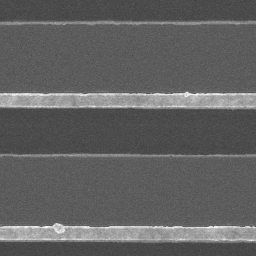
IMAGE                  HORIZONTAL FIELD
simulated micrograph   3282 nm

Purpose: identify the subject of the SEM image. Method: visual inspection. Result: lines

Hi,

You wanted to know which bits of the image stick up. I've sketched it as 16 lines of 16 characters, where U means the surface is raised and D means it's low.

DDDDDDDDDDDDDDDD
UUUUUUUUUUUUUUUU
UUUUUUUUUUUUUUUU
UUUUUUUUUUUUUUUU
UUUUUUUUUUUUUUUU
UUUUUUUUUUUUUUUU
UUUUUUUUUUUUUUUU
DDDDDDDDDDDDDDDD
DDDDDDDDDDDDDDDD
DDDDDDDDDDDDDDDD
UUUUUUUUUUUUUUUU
UUUUUUUUUUUUUUUU
UUUUUUUUUUUUUUUU
UUUUUUUUUUUUUUUU
UUUUUUUUUUUUUUUU
DDDDDDDDDDDDDDDD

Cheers